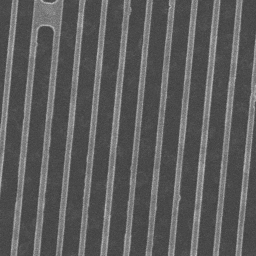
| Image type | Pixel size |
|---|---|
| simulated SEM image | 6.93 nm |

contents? parallel lines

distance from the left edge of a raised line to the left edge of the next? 155 nm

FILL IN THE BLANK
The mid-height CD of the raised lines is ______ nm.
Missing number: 36.2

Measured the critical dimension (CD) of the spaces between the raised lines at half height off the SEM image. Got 120 nanometers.